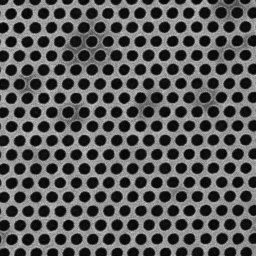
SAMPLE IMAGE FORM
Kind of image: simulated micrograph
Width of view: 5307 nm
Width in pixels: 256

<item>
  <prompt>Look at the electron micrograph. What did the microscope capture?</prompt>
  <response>a regular array of holes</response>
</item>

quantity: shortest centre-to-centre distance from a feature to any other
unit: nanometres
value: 330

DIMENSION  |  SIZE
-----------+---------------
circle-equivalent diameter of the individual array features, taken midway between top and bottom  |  240 nm